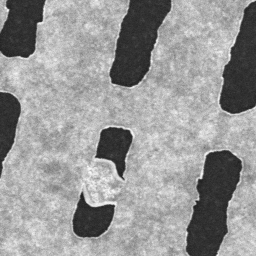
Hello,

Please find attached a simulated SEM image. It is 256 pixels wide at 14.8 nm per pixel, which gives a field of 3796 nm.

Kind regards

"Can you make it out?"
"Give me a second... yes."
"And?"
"holes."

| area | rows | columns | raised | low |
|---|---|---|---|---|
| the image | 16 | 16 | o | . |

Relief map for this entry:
...ooooo...oooo.
..oooooo..ooooo.
..ooooo...ooooo.
..ooooo..ooooo..
ooooooo..ooooo..
oooooooooooooo..
.ooooooooooooo..
.ooooooooooooooo
.ooooo..oooooooo
.ooooo..ooooo.oo
ooooooo.ooooo..o
oooooooooooo...o
oooooooooooo..oo
ooooo..ooooo..oo
ooooo..ooooo..oo
oooooooooooo..oo